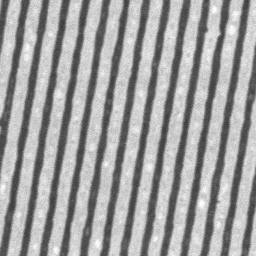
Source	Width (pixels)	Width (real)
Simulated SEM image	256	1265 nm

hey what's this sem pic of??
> parallel lines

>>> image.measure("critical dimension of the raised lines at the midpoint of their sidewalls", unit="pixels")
11.5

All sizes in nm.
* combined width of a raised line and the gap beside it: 97.9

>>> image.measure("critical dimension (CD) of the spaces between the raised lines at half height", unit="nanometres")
42.7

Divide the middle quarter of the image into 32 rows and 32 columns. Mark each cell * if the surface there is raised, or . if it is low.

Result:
**..***..**...***..***..***..***
**..***..***..***..***..***..***
*...***..**...***..***..***..***
*..***..***..***..***...**...**.
*..***..***..***..***..***..***.
*..***..***..***..***..***..***.
...***..***..***..***..***..***.
...**...**...**...***..***..***.
..***...**...**...**...**...**..
..***..***..***...**...**...**..
..***..***..***..***..***..***..
..***..***..***..***..***..***..
..***..***..***..***..***..***..
..**...**...**...***..***..***..
..**...**..***...***..***..***..
.***..***..***..***...**..***...
.***..***..***..***..***..***..*
.***..***..***..***..***..***..*
.***..***..***..***..***..***..*
.***..***..***..***..***..***..*
.**...**...**...***..**...**...*
.**..***...**..***...**..***...*
***..***..***..***..***..***..**
***..***..***..***..***..***..**
***..***..***..***..***..***..**
***..***.***...***..***..**...**
**...**..***...**...**...**...**
**..***..***..***...**...**...**
**..***..***..***..***..***..***
**..***..***..***..***..***..***
**..**...***..***..***..***..***
*...**...**...***..***..***..***